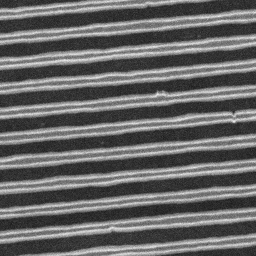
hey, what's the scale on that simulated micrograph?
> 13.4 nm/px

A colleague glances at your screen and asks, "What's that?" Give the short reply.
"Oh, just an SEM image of parallel lines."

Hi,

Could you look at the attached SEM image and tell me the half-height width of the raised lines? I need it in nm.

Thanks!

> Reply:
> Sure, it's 112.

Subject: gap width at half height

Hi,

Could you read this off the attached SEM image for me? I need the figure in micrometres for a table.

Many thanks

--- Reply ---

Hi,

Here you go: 0.212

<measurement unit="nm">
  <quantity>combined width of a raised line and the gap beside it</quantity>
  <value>332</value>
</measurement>